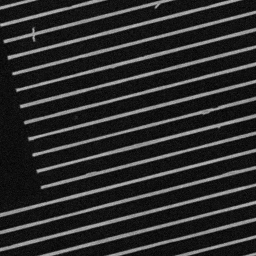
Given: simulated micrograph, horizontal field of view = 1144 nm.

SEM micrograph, parallel lines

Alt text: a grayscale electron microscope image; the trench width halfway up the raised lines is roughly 0.0644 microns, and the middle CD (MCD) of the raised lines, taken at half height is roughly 11.9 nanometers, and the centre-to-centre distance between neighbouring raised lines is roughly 74.8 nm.